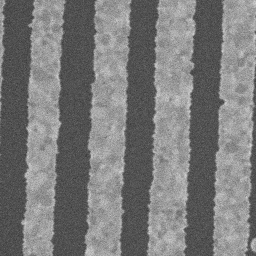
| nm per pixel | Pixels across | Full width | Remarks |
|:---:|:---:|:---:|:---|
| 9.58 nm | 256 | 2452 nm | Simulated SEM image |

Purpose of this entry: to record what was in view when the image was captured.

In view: one or a few lines or trenches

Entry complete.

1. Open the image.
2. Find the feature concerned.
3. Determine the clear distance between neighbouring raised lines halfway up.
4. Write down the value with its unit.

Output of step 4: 0.287 micrometres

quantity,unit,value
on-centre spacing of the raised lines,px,64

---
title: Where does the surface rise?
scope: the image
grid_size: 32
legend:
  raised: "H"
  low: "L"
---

HLLLHHHHLLLLHHHHLLLLHHHHLLLLHHHH
LLLLHHHHLLLLHHHHLLLLHHHHLLLLHHHH
LLLLHHHHLLLLHHHHLLLLHHHHLLLLHHHH
LLLLHHHHLLLLHHHHLLLLHHHHLLLLHHHH
LLLLHHHHLLLLHHHHLLLLHHHHLLLLHHHH
LLLLHHHHLLLLHHHHLLLLHHHHLLLLHHHH
LLLLHHHHLLLLHHHHLLLHHHHHLLLLHHHH
LLLLHHHLLLLLHHHHLLLHHHHHLLLLHHHH
LLLLHHHLLLLLHHHHLLLHHHHHLLLLHHHH
LLLLHHHLLLLLHHHHLLLHHHHHLLLLHHHH
LLLLHHHHLLLLHHHHLLLHHHHHLLLLHHHH
LLLLHHHLLLLLHHHHLLLLLHHHLLLHHHHH
LLLLHHHLLLLLHHHHLLLHHHHHLLLLHHHH
LLLLHHHLLLLHHHHHLLLHHHHHLLLLHHHH
LLLLHHHLLLLHHHHHLLLHHHHHLLLHHHHL
LLLLHHHLLLLLHHHHLLLHHHHHLLLHHHHH
LLLLLHHLLLLHHHHHLLLHHHHHLLLHHHHL
LLLHHHHLLLLHHHHHLLLHHHHHLLLHHHHL
LLLLHHHLLLLHHHHHLLLHHHHHLLLHHHHL
LLLHHHHLLLLHHHHLLLLHHHHHLLLHHHHL
LLLHHHHLLLLHHHHLLLLHHHHHLLLHHHHL
LLLHHHHLLLLHHHHLLLLHHHHLLLLHHHHL
LLLHHHHLLLLHHHHLLLLHHHHLLLLHHHHL
LLLHHHHLLLLHHHHLLLLHHHHLLLLHHHHL
LLLHHHHLLLLHHHHLLLLHHHHLLLLHHHHL
LLLHHHHLLLLHHHHLLLLHHHHLLLLHHHHL
LLLHHHHLLLLHHHHLLLLHHHHLLLLHHHHL
LLLHHHHLLLLHHHHLLLLHHHHLLLLHHHHL
LLLHHHHLLLLHHHHLLLLHHHHLLLLHHHHL
LLLHHHHLLLLHHHHLLLLHHHHLLLLHHHHL
LLLHHHLLLLLHHHHLLLLHHHHLLLLHHHHH
LLLHHHHLLLLHHHHLLLLHHHHLLLLHHHHL